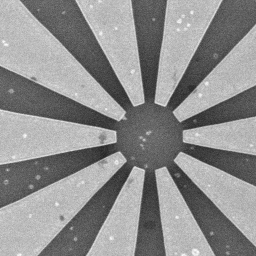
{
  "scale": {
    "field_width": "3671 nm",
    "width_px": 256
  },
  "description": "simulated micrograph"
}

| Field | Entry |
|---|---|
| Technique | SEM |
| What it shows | groups of lines, slits or small figures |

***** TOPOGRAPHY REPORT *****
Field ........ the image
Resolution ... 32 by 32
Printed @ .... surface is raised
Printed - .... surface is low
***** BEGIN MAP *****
@@@-------@@@@@@-----@@@@@@@----
@@@@------@@@@@@@----@@@@@@-----
@@@@@------@@@@@@----@@@@@------
@@@@@@-----@@@@@@----@@@@@------
@@@@@@@-----@@@@@---@@@@@------@
@@@@@@@@----@@@@@---@@@@@-----@@
@@@@@@@@@----@@@@---@@@@-----@@@
@@@@@@@@@@----@@@---@@@@----@@@@
-@@@@@@@@@----@@@---@@@----@@@@@
---@@@@@@@@----@@@--@@@---@@@@@@
-----@@@@@@@---@@@--@@---@@@@@@@
-------@@@@@@---@@--@@--@@@@@@--
---------@@@@@--@@-@@--@@@@@----
-----------@@@@-------@@@@------
@@@@---------@@-------@@--------
@@@@@@@@@@-----------------@@@@@
@@@@@@@@@@@@@@---------@@@@@@@@@
@@@@@@@@@@@@@@---------@@@@@@@@@
@@@@@@@@@@@----------------@@@@@
@@@@@@--------@-------@@--------
------------@@@-------@@@@------
----------@@@@--@@--@--@@@@@----
--------@@@@@@--@@--@@--@@@@@@--
------@@@@@@---@@@--@@---@@@@@@@
----@@@@@@@@---@@@--@@@---@@@@@@
-@@@@@@@@@@---@@@@--@@@----@@@@@
@@@@@@@@@@----@@@---@@@@----@@@@
@@@@@@@@@----@@@@---@@@@-----@@@
@@@@@@@@-----@@@@---@@@@@-----@@
@@@@@@@-----@@@@@---@@@@@------@
@@@@@@------@@@@@----@@@@@------
@@@@@------@@@@@@----@@@@@@-----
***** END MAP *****